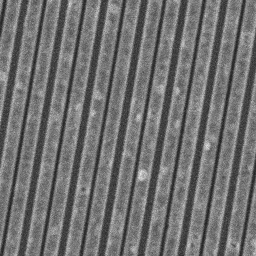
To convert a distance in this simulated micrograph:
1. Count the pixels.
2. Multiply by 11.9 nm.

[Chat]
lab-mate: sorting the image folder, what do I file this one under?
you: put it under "parallel lines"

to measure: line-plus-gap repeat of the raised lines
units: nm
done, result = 234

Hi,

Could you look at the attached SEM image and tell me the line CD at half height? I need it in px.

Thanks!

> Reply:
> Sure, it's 13.4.